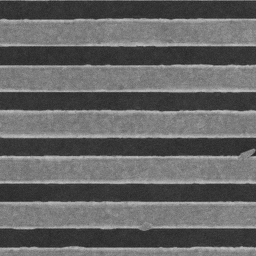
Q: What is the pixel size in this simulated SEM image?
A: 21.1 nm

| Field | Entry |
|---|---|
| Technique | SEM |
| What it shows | lines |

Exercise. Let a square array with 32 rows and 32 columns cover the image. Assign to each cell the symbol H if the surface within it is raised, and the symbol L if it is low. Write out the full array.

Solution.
LLLLLLLLLLLLLLLLLLLLLLLLLLLLLLLL
LLLLLLLLLLLLLLLLLLLLLLLLLLLLLLLL
LLLLLLLLLLLLHLLLLLLHHLLLLHHHHHHH
HHHHHHHHHHHHHHHHHHHHHHHHHHHHHHHH
HHHHHHHHHHHHHHHHHHHHHHHHHHHHHHHH
HHHHHHHHHHHHHHHHHHHHHHHHHHHHHHHH
LLLLLLLLLLLLLLLLLLLLLLLLLLLLLLLL
LLLLLLLLLLLLLLLLLLLLLLLLLLLLLLLL
HHHHHHHHHHHHHHHHHHHHHHHHHHHHHHHH
HHHHHHHHHHHHHHHHHHHHHHHHHHHHHHHH
HHHHHHHHHHHHHHHHHHHHHHHHHHHHHHHH
LLLLLLLLLLLLLLLLLLLLLLLLLLLLLLLL
LLLLLLLLLLLLLLLLLLLLLLLLLLLLLLLL
LLLLLLLLLLLLLLLLLLLLLLLLLLLLLLLL
HHHHHHHHHHHHHHHHHHHHHHHHHHHHHHHH
HHHHHHHHHHHHHHHHHHHHHHHHHHHHHHHH
HHHHHHHHHHHHHHHHHHHHHHHHHHHHHHHH
LLLLLLLLLLLLLLLLLLLLLLLLLLLLLLLL
LLLLLLLLLLLLLLLLLLLLLLLLLLLLLLLL
LLLLLLLLLLLLLLLLLLLLLLLLLLLLLLHH
HHHHHHHHHHHHHHHHHHHHHHHHHHHHHHHH
HHHHHHHHHHHHHHHHHHHHHHHHHHHHHHHH
HHHHHHHHHHHHHHHHHHHHHHHHHHHHHHHH
LLLLLLLLLLLLLLLLLLLLLLLLLLLLLLLL
LLLLLLLLLLLLLLLLLLLLLLLLLLLLLLLL
HHHHHHHHHHHHHHHHHHHHHHHHHHHHHHHH
HHHHHHHHHHHHHHHHHHHHHHHHHHHHHHHH
HHHHHHHHHHHHHHHHHHHHHHHHHHHHHHHH
LLHLLLLLLLLLLLLLLHHLLLLLLLLLLLLL
LLLLLLLLLLLLLLLLLLLLLLLLLLLLLLLL
LLLLLLLLLLLLLLLLLLLLLLLLLLLLLLLL
HHHHHHHHHHHHHHHHHHHHHHHHHHHHHHHH